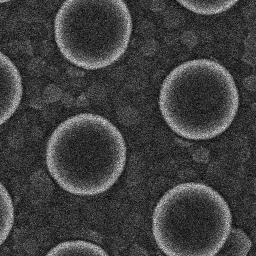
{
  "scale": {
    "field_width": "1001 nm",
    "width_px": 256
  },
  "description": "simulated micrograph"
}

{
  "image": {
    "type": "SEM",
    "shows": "raised bodies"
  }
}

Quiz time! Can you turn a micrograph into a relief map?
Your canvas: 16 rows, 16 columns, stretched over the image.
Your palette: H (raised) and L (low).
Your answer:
LLLLHHHHLLLLHHLL
LLLLHHHHLLLLLLLL
LLLLHHHHLLLLLLLL
LLLLHHHLLLLLLLLL
HLLLLLLLLLLHHHLL
HLLLLLLLLLHHHHHL
HLLLLLLLLLHHHHHL
LLLLHHLLLLHHHHLL
LLLHHHHLLLLLHLLL
LLLHHHHHLLLLLLLL
LLLHHHHHLLLLLLLL
LLLLHHHLLLLLLLLL
HLLLLLLLLLHHHHLL
HLLLLLLLLLHHHHLL
LLLLLLLLLLHHHHLL
LLLLHHLLLLHHHHLL